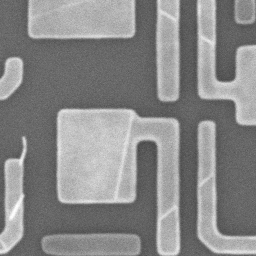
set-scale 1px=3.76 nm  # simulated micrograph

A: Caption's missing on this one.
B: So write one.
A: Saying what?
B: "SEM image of wiring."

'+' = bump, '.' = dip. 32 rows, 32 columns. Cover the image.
....+++++++++++++...++...++..+++
....+++++++++++++...++...++..+++
....+++++++++++++...++...++...++
....+++++++++++++...++...++.....
....++++++++++++....++...++.....
....................++...++.....
....................++...++...++
.+..................++...++...++
.++.................++...++...++
+++.................++...++..+++
++..................++...+++++++
++..................++...+++++++
....................++.......+++
..............................++
.......++++++++++.............++
.......+++++++++++++++...++...++
.......+++++++++++++++...++.....
.......+++++++++++.+++...++.....
.......++++++++++...++...++.....
.......++++++++++...++...++.....
.++....++++++++++...++...++.....
.++....++++++++++...++...++.....
.++....++++++++++...++...++.....
.++....++++++++++...++...++.....
.++....++++++++++...++...++.....
.++.................++...++.....
.++.................++...++.....
.++.................++...++.....
.++.................++...++.....
+++...+++++++++++...++...+++....
++...+++++++++++++..++....++++++
+.....+++++++++++...++.....+++++